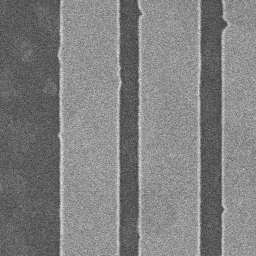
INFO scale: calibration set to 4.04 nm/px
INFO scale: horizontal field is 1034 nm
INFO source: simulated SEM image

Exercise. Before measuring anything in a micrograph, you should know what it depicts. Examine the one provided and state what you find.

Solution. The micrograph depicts one or a few lines or trenches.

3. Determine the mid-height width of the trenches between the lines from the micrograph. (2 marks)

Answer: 0.091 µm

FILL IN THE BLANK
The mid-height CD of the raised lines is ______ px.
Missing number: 59.3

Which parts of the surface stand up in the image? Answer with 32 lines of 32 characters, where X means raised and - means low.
--------XXXXXXX--XXXXXXXX---XXXX
--------XXXXXXX---XXXXXXX---XXXX
--------XXXXXXX---XXXXXXX---XXXX
--------XXXXXXX--XXXXXXXX---XXXX
--------XXXXXXX--XXXXXXXX---XXXX
--------XXXXXXX---XXXXXXX---XXXX
-------XXXXXXXX---XXXXXXX---XXXX
-------XXXXXXXX---XXXXXXX---XXXX
--------XXXXXXX---XXXXXXX---XXXX
--------XXXXXXX---XXXXXXX---XXXX
--------XXXXXXX---XXXXXXX---XXXX
--------XXXXXXX---XXXXXXX---XXXX
--------XXXXXXX---XXXXXXX---XXXX
--------XXXXXXX---XXXXXXX---XXXX
--------XXXXXXX--XXXXXXXX---XXXX
--------XXXXXXX--XXXXXXXX---XXXX
--------XXXXXXX---XXXXXXX---XXXX
--------XXXXXXX---XXXXXXX---XXXX
--------XXXXXXX---XXXXXXX---XXXX
--------XXXXXXX---XXXXXXX---XXXX
--------XXXXXXX--XXXXXXXX---XXXX
--------XXXXXXX---XXXXXXX---XXXX
--------XXXXXXX---XXXXXXX---XXXX
--------XXXXXXX---XXXXXXX---XXXX
--------XXXXXXX---XXXXXXX---XXXX
--------XXXXXXX---XXXXXXX---XXXX
--------XXXXXXX---XXXXXXX---XXXX
--------XXXXXXX---XXXXXXX---XXXX
--------XXXXXXX---XXXXXXX---XXXX
--------XXXXXXX---XXXXXXX---XXXX
--------XXXXXXX--XXXXXXXX---XXXX
--------XXXXXXX--XXXXXXXX---XXXX